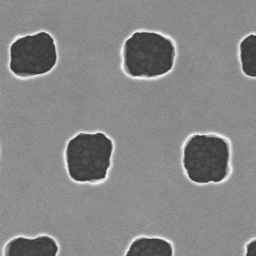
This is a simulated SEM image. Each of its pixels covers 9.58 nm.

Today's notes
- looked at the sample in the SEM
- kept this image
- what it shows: holes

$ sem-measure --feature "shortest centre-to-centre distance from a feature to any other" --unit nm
1110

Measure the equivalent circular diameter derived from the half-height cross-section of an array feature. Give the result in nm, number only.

464